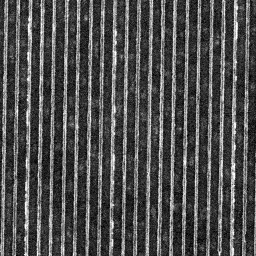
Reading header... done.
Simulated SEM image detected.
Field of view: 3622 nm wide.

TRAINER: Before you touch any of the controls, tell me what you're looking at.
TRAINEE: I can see parallel lines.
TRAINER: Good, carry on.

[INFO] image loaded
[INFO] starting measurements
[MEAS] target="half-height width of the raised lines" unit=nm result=40.7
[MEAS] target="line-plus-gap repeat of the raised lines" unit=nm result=171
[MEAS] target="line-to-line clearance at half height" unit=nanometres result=138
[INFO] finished